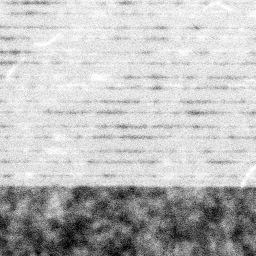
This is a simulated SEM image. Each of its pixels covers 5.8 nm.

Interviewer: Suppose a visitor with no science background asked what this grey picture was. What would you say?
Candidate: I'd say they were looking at parallel lines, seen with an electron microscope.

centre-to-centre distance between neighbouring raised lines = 0.0715 microns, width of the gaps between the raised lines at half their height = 38.4 nanometers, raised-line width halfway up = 24.6 nanometres